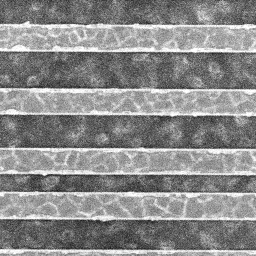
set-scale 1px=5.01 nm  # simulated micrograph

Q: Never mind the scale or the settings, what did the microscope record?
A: parallel lines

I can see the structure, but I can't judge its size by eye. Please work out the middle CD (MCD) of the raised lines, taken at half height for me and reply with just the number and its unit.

125 nm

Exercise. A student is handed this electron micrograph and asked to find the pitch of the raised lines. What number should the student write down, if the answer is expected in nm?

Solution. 280